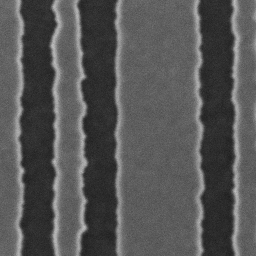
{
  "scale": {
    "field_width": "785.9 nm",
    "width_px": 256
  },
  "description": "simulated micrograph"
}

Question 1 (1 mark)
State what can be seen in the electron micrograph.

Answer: lines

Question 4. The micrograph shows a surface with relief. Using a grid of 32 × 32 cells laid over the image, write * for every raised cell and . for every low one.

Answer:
**.....***.....**********....***
**.....***.....**********....***
***....***.....**********....***
***....***.....**********....***
***....***.....**********....***
***....***.....**********....***
***....***.....**********....***
***....***.....**********....***
***....***....***********....***
***....***.....**********....***
***....***.....**********....***
***....***....***********....***
**.....***....***********....***
***....****....**********....***
**.....***.....**********.....**
**.....***.....**********....***
**.....***....***********....***
**.....****....**********....***
**.....***.....**********....***
***....***....***********.....**
***....****....**********....***
***....***.....**********....***
***....***.....**********....***
***....***.....**********....***
***....****....**********....***
***....****....**********.....**
***....***.....**********....***
**.....***.....**********....***
**.....****....**********....***
***....***.....**********....***
***....***.....**********....***
**.....***.....**********....***